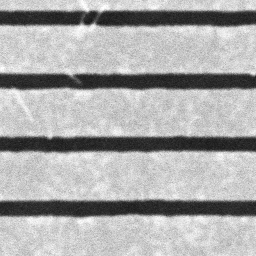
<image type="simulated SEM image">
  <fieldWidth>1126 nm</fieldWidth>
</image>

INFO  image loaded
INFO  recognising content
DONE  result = lines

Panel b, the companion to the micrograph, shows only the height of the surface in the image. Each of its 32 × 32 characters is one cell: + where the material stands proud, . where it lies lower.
++++++++++++++++++++++++++++++++
................................
................................
++++++++++++++++++++++++++++++++
++++++++++++++++++++++++++++++++
++++++++++++++++++++++++++++++++
++++++++++++++++++++++++++++++++
++++++++++++++++++++++++++++++++
++++++++++++++++++++++++++++++++
................................
................................
++++++++++++++++++++++++++++++++
++++++++++++++++++++++++++++++++
++++++++++++++++++++++++++++++++
++++++++++++++++++++++++++++++++
++++++++++++++++++++++++++++++++
++++++++++++++++++++++++++++++++
................................
................................
++++++++++++++++++++++++++++++++
++++++++++++++++++++++++++++++++
++++++++++++++++++++++++++++++++
++++++++++++++++++++++++++++++++
++++++++++++++++++++++++++++++++
++++++++++++++++++++++++++++++++
................................
................................
++++++++++++++++++++++++++++++++
++++++++++++++++++++++++++++++++
++++++++++++++++++++++++++++++++
++++++++++++++++++++++++++++++++
++++++++++++++++++++++++++++++++